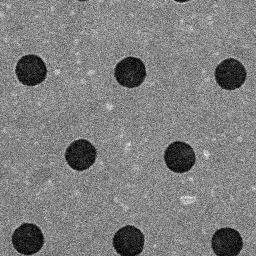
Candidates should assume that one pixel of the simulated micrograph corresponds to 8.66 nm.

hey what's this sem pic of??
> holes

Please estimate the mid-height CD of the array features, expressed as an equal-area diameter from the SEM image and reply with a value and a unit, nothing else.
284 nm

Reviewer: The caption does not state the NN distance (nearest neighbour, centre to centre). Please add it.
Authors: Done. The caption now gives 0.842 micrometres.